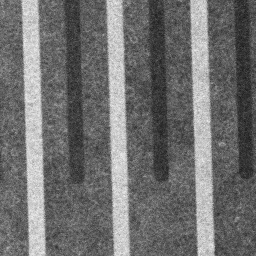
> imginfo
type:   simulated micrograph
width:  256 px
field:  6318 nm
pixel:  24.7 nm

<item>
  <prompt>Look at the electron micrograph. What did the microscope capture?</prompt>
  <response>parallel lines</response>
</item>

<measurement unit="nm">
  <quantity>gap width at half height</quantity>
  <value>660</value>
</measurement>